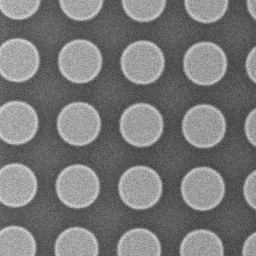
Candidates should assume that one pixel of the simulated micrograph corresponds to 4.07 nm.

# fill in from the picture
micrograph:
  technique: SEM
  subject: an array of small figures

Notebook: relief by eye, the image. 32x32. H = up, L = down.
HHHHHLLLHHHHHLLHHHHHHLLHHHHHLLLH
HHHHLLLLHHHHLLLLHHHHLLLLHHHHLLLH
LLLLLLLLLLLLLLLLLHHLLLLLLHHLLLLL
LLLLLLLLLLLLLLLLLLLLLLLLLLLLLLLL
LLLLLLLLLLLLLLLLLLLLLLLLLLLLLLLL
HHHHLLLLLHHHLLLLHHHLLLLLLHHLLLLL
HHHHHLLLHHHHLLLLHHHHLLLHHHHHLLLH
HHHHHLLHHHHHHLLHHHHHLLLHHHHHLLLH
HHHHHLLLHHHHLLLHHHHHLLLHHHHHLLLH
HHHHLLLLHHHHLLLLHHHHLLLLHHHHLLLH
LLLLLLLLLLLLLLLLLLLLLLLLLHLLLLLL
LLLLLLLLLLLLLLLLLLLLLLLLLLLLLLLL
LLLLLLLLLLLLLLLLLLLLLLLLLLLLLLLL
HHHHLLLLHHHHLLLLHHHLLLLLHHHLLLLL
HHHHHLLHHHHHLLLHHHHHLLLHHHHHLLLH
HHHHHLLHHHHHLLLHHHHHLLLHHHHHLLLH
HHHHLLLHHHHHLLLHHHHHLLLHHHHHLLLH
LHHHLLLLHHHHLLLLHHHHLLLLHHHHLLLH
LLLLLLLLLLLLLLLLLLLLLLLLLLLLLLLL
LLLLLLLLLLLLLLLLLLLLLLLLLLLLLLLL
LHLLLLLLLLLLLLLLLLLLLLLLLLLLLLLL
HHHHLLLLHHHHLLLLHHHLLLLLHHHLLLLL
HHHHHLLHHHHHLLLHHHHHLLLHHHHHLLLH
HHHHLLLHHHHHLLLHHHHHLLLHHHHHLLLH
HHHHLLLHHHHHLLLHHHHHLLLHHHHHLLLH
LHHLLLLLHHHLLLLLHHHLLLLLHHHLLLLH
LLLLLLLLLLLLLLLLLLLLLLLLLLLLLLLL
LLLLLLLLLLLLLLLLLLLLLLLLLLLLLLLL
LHHLLLLLLHLLLLLLLLLLLLLLLLLLLLLL
HHHHLLLHHHHHLLLHHHHLLLLHHHHLLLLH
HHHHLLLHHHHHLLLHHHHHLLLHHHHHLLLH
HHHHLLLHHHHHLLLHHHHHLLLHHHHHLLHH